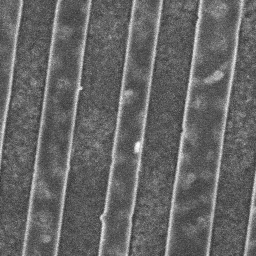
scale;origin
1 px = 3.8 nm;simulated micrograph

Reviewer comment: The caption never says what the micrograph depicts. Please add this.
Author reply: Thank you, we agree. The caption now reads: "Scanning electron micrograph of one or a few lines or trenches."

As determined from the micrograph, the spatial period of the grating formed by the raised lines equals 277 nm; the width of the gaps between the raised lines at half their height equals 145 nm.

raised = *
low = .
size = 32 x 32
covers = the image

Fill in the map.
***....****......***.....*****..
***....****.....****.....*****..
**.....****.....****.....*****..
**.....****.....****.....*****..
**.....****.....****....******..
**....*****.....****....******..
**....****......***.....******..
**....****......***.....*****...
**....****......***.....*****...
**....****.....****.....*****...
*.....****.....****.....*****...
*.....****.....****.....*****...
*....*****.....****....******...
*....*****.....***.....*****....
*....****......***.....*****....
*....****......***.....*****....
.....****......***.....*****....
.....****.....****.....*****....
.....****.....****....******....
....*****.....****....******....
....*****.....***.....*****.....
....****......***.....*****.....
....****......***.....*****.....
....****.....****.....*****.....
....****.....****.....*****.....
....****.....****.....*****.....
....****.....****....******....*
...*****.....***.....******....*
...****......***.....*****.....*
...****......***.....*****.....*
...****......***.....*****.....*
...****.....****.....*****.....*